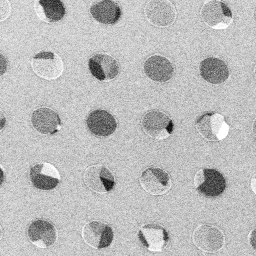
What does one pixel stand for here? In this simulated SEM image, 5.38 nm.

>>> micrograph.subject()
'a regular array of raised bodies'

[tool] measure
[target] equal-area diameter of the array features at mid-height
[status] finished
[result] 0.16 microns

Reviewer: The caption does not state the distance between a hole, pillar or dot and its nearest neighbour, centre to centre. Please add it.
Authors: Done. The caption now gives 298 nm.